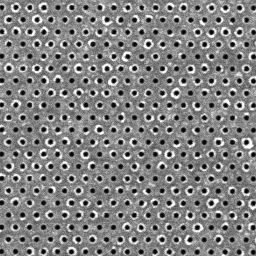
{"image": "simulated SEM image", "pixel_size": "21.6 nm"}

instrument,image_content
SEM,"a regular array of holes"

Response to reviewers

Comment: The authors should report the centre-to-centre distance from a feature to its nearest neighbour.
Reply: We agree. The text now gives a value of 13.5 px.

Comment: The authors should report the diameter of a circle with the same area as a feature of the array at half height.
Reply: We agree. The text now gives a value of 119 nanometres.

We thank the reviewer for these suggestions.